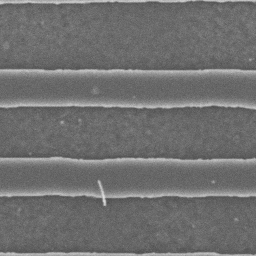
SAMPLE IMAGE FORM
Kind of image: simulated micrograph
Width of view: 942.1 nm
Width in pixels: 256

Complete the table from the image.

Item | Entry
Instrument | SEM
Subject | lines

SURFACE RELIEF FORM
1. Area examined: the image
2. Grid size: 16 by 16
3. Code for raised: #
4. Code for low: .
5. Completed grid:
................
................
................
................
################
################
################
................
................
................
################
################
................
................
................
................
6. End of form